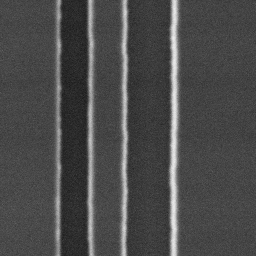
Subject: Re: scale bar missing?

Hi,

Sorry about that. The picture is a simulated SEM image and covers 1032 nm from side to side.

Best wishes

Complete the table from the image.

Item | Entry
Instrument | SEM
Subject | lines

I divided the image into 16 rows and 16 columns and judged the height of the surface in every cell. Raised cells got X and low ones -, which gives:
XXXX--XX---XXXXX
XXXX--XX---XXXXX
XXXX--XX---XXXXX
XXXX--XX---XXXXX
XXXX--XX---XXXXX
XXXX--XX---XXXXX
XXXX--XX---XXXXX
XXXX--XX---XXXXX
XXXX--XX---XXXXX
XXXX--XX---XXXXX
XXXX--XX---XXXXX
XXXX--XX---XXXXX
XXXX--XX---XXXXX
XXXX--XX---XXXXX
XXXX--XX---XXXXX
XXXX--XX---XXXXX